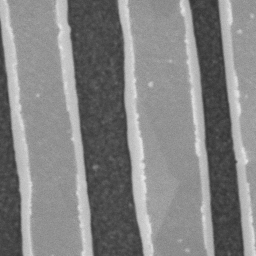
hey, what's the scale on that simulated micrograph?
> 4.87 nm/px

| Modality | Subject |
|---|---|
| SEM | one or a few lines or trenches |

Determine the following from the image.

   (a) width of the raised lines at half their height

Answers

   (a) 300 nanometres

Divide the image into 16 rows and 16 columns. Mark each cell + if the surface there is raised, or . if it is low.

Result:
++++....++++..++
++++....++++..++
++++....++++..++
.+++....++++..++
.+++....++++..++
.+++....++++..++
.++++...++++...+
.++++...++++...+
.++++...+++++..+
.++++...+++++..+
.++++....++++..+
..+++....++++..+
..+++....++++..+
..+++....++++..+
..+++....++++..+
..+++....++++...